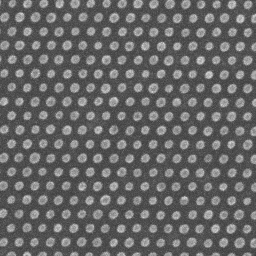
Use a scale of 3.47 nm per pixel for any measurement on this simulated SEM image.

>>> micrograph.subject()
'a regular array of raised bodies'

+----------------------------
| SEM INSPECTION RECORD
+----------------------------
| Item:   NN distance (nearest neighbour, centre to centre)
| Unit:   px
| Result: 15.4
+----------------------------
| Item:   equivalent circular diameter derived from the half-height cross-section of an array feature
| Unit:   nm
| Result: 28.5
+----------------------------